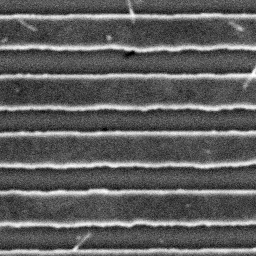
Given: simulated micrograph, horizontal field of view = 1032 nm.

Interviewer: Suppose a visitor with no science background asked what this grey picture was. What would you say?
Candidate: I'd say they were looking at lines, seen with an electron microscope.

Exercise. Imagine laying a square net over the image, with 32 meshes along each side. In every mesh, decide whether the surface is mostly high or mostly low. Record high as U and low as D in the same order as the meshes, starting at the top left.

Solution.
DDDDDDDDDDDDDDDDDDDDDDDDDDDDDDDD
DDDDDDDDDDDDDDDDDDDDDDDDDDDDDDDD
UUUUUUUUUUUUUUUUUUUUUUUUUUUUUUUU
UUUUUUUUUUUUUUUUUUUUUUUUUUUUUUUU
UUUUUUUUUUUUUUUUUUUUUUUUUUUUUUUU
UUUUUUUUUUUUUUUUUUUUUUUUUUUUUUUU
DDDDDDDDDDDDDDDDDDDDDDDDDDDDDDDD
DDDDDDDDDDDDDDDDDDDDDDDDDDDDDDDD
DDDDDDDDDDDDDDDDDDDDDDDDDDDDDDDD
UUUUUUUUUUUUUUUUUUUUUUUUUUUUUUUU
UUUUUUUUUUUUUUUUUUUUUUUUUUUUUUUU
UUUUUUUUUUUUUUUUUUUUUUUUUUUUUUUU
UUUUUUUUUUUUUUUUUUUUUUUUUUUUUUUU
UUUUUUUUUUUUUUUUUUUUUUUUUUUUUUUU
DDDDDDDDDDDDDDDDDDDDDDDDDDDDDDDD
DDDDDDDDDDDDDDDDDDDDDDDDDDDDDDDD
DDDDDDDDDDDDDDDDDDDDUDDDDDUDUUDU
UUUUUUUUUUUUUUUUUUUUUUUUUUUUUUUU
UUUUUUUUUUUUUUUUUUUUUUUUUUUUUUUU
UUUUUUUUUUUUUUUUUUUUUUUUUUUUUUUU
UUUUUUUUUUUUUUUUUUUUUUUUUUUUUUUD
DDDDDDDDDDDDDDDDDDDDDDDDDDDDDDDD
DDDDDDDDDDDDDDDDDDDDDDDDDDDDDDDD
DDDDDDDDDDDDDDDDDDDDDDDDDDDDDDDD
UUUUUUUUUUUUUUUUUUUUUUUUUUUUUUUU
UUUUUUUUUUUUUUUUUUUUUUUUUUUUUUUU
UUUUUUUUUUUUUUUUUUUUUUUUUUUUUUUU
UUUUUUUUUUUUUUUUUUUUUUUUUUUUUUUU
DDDDDDDDDDDDDDDDDDDDDDDDDDDDDDDD
DDDDDDDDDDDDDDDDDDDDDDDDDDDDDDDD
DDDDDDDDDDDDDDDDDDDDDDDDDDDDDDDD
UUUUUUUUUUUUUUUUUUUUUUUUUUUUUUUU